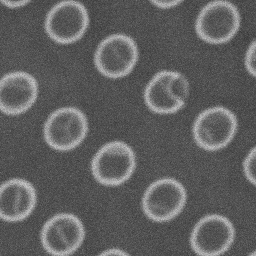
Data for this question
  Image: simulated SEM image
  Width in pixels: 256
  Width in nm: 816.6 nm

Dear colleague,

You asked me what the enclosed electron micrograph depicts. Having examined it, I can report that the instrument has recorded a regular array of raised bodies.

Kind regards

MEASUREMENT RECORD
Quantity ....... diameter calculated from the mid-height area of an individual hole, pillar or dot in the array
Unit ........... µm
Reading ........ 0.128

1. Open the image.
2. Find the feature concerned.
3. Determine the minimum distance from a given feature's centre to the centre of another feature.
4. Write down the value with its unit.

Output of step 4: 191 nm